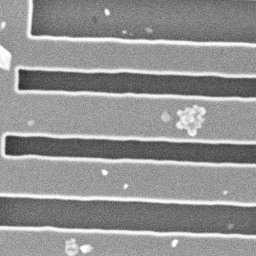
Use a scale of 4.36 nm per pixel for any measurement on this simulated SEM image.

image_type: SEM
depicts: groups of lines, slits or small figures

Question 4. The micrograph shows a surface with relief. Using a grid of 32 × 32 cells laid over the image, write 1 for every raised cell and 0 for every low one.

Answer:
11110000000000000000000000000000
11110000000000000000000000000000
11110000000000000000000000000000
11110000000000000000000000000000
11110000000000000000000000000000
11111111111111111111111111100000
11111111111111111111111111111111
11111111111111111111111111111111
11111111111111111111111111111111
11000000000000000000000000001111
11000000000000000000000000000000
11111000000000000000000000000000
11111111111111111111111111111111
11111111111111111111111111111111
11111111111111111111111111111111
11111111111111111111111111111111
11111111111111111111111111111111
10000000000000000000011111111111
00000000000000000000000000000000
10000000000000000000000000000000
11111111111111111111111110000000
11111111111111111111111111111111
11111111111111111111111111111111
11111111111111111111111111111111
00011111111111111111111111111111
00000000000000000000000000000111
00000000000000000000000000000000
00000000000000000000000000000000
10000000000000000000000000000000
11111111111111111111111111111100
11111111111111111111111111111111
11111111111111111111111111111111